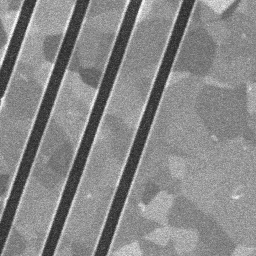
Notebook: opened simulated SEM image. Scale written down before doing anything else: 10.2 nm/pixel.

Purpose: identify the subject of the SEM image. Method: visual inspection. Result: parallel lines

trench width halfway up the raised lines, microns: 0.135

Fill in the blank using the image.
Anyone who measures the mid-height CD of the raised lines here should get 376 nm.